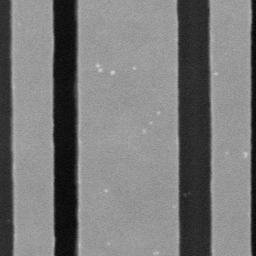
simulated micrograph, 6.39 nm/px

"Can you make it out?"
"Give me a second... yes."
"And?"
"lines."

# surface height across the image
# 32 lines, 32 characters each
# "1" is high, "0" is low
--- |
01111110001111111111110000111110
00111110001111111111110000111110
00111110001111111111110000111110
00111110001111111111110000111110
00111110001111111111110000111110
00111110001111111111110000111110
00111110001111111111110000111110
00111110001111111111110000111110
00111110001111111111110000111110
00111110001111111111110000111110
00111110001111111111110000111110
00111110001111111111110000111110
00111110001111111111110000111110
00111110001111111111110000111110
00111110001111111111110000111110
00111110001111111111110000111110
00111110001111111111110000011110
00111110001111111111110000011110
00111110001111111111110000011110
00111110001111111111110000011110
00111110001111111111110000111110
00111110001111111111110000111110
00111110001111111111110000111110
00111110001111111111110000111110
00111110001111111111110000111110
00111110001111111111110000011110
00111110001111111111110000011110
00111110001111111111110000011110
00111110001111111111110000011110
00111110001111111111110000011110
00111110001111111111110000011110
00111110001111111111110000011110